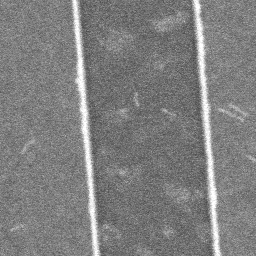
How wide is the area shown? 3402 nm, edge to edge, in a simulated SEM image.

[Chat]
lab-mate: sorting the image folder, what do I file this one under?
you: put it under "one or a few lines or trenches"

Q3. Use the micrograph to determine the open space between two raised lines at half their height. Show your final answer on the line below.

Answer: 1600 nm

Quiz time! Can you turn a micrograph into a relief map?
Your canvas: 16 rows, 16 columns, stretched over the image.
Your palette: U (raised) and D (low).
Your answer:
UUUUUDDDDDDDUUUU
UUUUUDDDDDDDUUUU
UUUUUDDDDDDDDUUU
UUUUUDDDDDDDDUUU
UUUUUDDDDDDDDUUU
UUUUUDDDDDDDDUUU
UUUUUDDDDDDDDUUU
UUUUUDDDDDDDDUUU
UUUUUDDDDDDDDUUU
UUUUUDDDDDDDDUUU
UUUUUUDDDDDDDUUU
UUUUUUDDDDDDDUUU
UUUUUUDDDDDDDUUU
UUUUUUDDDDDDDUUU
UUUUUUDDDDDDDUUU
UUUUUUDDDDDDDDUU